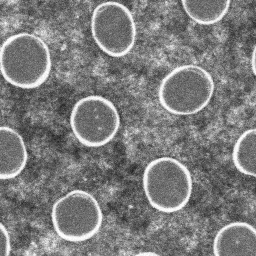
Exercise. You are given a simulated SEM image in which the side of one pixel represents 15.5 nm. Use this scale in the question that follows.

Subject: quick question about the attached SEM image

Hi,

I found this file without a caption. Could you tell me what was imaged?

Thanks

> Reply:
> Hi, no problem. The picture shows raised bodies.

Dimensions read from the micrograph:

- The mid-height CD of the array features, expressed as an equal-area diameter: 0.733 microns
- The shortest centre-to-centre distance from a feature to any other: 1490 nm